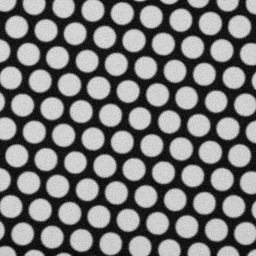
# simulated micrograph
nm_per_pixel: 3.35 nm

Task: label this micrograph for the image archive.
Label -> an array of small figures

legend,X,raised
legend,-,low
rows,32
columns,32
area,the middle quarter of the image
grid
---XXXXX--XXXXXX--XXXXX--XXXXX--
----XXXX---XXXX---XXXXX--XXXXX--
-X----------XXX---XXXXX--XXXXX--
XXXX---XXX---------XXX----XXXX--
XXXX--XXXXX----XXX---------XX---
XXXX--XXXXX---XXXX----XXX-------
XXXX--XXXXX--XXXXXX--XXXXX---XXX
XXX---XXXXX--XXXXXX--XXXXX--XXXX
-------XXX----XXXX---XXXXX--XXXX
---XXX---------XX----XXXXX--XXXX
--XXXXX---XXX----------X-----XXX
-XXXXXX--XXXXX---XXXX-----------
--XXXXX--XXXXX--XXXXX---XXXX----
--XXXXX--XXXXX--XXXXXX--XXXXX---
---XX----XXXXX--XXXXXX--XXXXX--X
XX---------X-----XXXX---XXXXX--X
XX---XXXX---------------XXXX---X
XXX--XXXXX---XXXX---------------
XXX--XXXXX--XXXXX---XXXX----XX--
XX---XXXXX--XXXXX--XXXXXX--XXXXX
X----XXXX---XXXXX--XXXXXX--XXXXX
-------------XXXX--XXXXX--XXXXXX
-XXXX---------------XXXX---XXXXX
XXXXX---XXXX----------------XXX-
XXXXXX--XXXXX--XXXXX----X-------
XXXXX--XXXXXX--XXXXX---XXXX----X
-XXXX---XXXXX--XXXXX--XXXXXX--XX
--------XXXX---XXXXX--XXXXXX-XXX
----------------XXX---XXXXX---XX
X---XXXX----XX---------XXX----XX
X--XXXXX---XXXX----XX----------X
X--XXXXXX-XXXXXX--XXXXX----XX---